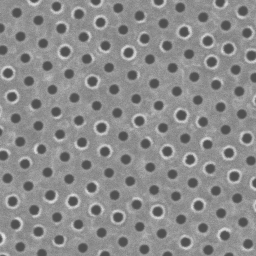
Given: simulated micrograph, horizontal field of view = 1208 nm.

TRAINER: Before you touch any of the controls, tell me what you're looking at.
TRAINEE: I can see a regular array of holes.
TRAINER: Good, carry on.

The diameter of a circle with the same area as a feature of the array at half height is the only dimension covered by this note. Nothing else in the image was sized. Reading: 43.6 nanometres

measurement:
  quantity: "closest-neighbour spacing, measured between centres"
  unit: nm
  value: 105